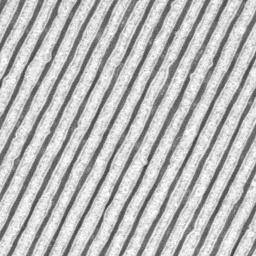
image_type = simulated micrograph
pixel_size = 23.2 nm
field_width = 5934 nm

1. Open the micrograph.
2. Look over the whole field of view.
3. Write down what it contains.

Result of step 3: parallel lines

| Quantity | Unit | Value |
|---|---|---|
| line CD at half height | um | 0.253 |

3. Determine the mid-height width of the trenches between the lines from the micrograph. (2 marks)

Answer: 135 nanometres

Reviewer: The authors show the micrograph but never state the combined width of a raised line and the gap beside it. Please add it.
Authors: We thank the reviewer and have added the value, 0.385 microns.